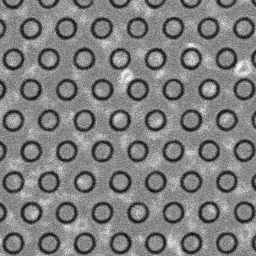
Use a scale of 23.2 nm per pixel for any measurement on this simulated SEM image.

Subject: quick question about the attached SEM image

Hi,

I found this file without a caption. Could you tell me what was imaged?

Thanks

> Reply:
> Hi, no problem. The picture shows a regular array of ring-shaped grooves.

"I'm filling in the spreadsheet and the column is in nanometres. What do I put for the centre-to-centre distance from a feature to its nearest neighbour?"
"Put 808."